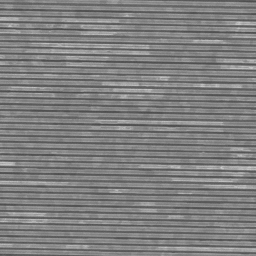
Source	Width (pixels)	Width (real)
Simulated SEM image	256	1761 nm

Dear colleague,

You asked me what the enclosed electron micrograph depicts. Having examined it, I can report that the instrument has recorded parallel lines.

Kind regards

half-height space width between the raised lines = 20.6 nanometres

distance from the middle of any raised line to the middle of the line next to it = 43.3 nm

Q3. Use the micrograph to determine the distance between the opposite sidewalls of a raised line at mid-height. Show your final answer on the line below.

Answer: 20.6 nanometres